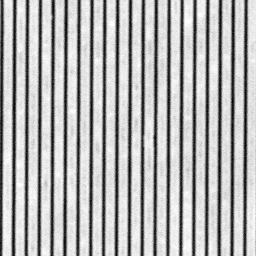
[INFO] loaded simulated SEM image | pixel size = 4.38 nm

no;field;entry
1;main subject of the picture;parallel lines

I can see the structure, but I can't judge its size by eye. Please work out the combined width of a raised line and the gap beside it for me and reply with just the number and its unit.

56.3 nanometres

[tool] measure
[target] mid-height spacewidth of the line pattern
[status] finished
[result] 14.8 nm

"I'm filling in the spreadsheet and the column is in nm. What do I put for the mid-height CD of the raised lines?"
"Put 41.6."